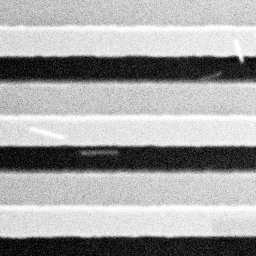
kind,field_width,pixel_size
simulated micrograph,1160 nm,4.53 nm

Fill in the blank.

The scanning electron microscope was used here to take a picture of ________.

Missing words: lines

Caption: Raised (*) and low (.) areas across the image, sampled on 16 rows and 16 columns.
****************
****************
****************
...............*
................
****************
****************
****************
****************
................
................
****************
****************
****************
****************
................